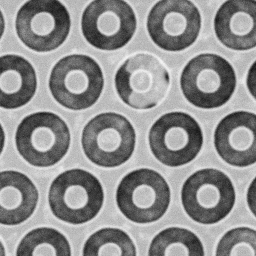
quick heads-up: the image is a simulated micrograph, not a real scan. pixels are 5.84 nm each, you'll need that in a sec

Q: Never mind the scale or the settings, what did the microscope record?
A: a regular array of ring-shaped grooves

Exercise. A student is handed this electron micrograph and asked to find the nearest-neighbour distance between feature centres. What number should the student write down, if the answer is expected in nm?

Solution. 383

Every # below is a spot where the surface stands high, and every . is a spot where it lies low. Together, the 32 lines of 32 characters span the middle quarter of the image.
.........#####.......#########..
.........####......#.###..####..
.####.....###....#######..###...
######....###....#######..###...
######....##.....########..##...
######....###....############...
.####.....###.....###########...
.........####......###########..
.........#####....############..
........#######...###...#######.
.......#########.......#########
##...##############.############
########......###########......#
#######........#########........
######...........######.........
.####............#####..........
.####.....###.....###.....####..
..##.....#####....###.....####..
..##....######....###....######.
..##....######....###....######.
..###....####.....###.....####..
.####.....###.....####.....##...
.####............#####..........
######...........######.........
#######.........########.......#
#########.....############...###
#....############......#########
.......########.........########
........######...........######.
.........#####............####..
..##.....####......##.....####..
.####.....###.....####.....##...